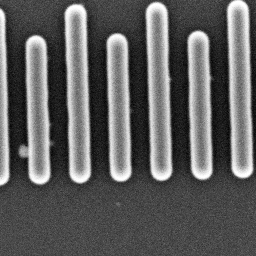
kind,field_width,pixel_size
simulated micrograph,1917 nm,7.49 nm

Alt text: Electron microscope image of groups of lines, slits or small figures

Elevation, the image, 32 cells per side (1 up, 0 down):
00000000000000000001000000000110
00000000111000000011100000000110
00000000111000000011100000000110
00000000111000000011100000000110
00000000111000100001100011000110
10011100111000110001100011000110
10011100111000110001100011000110
10011100111000110001100011000110
10011100111000110001100011000110
10011100011000110001100011000110
10011100011000110001100011000110
10001100011000110001100011000110
10001100011000110001100011000110
10001100011000110001100011000110
10001100011000110001100011000110
10001100011000110001100011000110
10001100011000110001100011000110
10001100011000110001100011000110
10001100011000110001100011000110
10001100011000110001100011000110
10001100011000110001100011000110
10001100011000110001100011000110
10001100011000000000000000000000
00000000000000000000000000000000
00000000000000000000000000000000
00000000000000000000000000000000
00000000000000000000000000000000
00000000000000000000000000000000
00000000000000000000000000000000
00000000000000000000000000000000
00000000000000000000000000000000
00000000000000000000000000000000